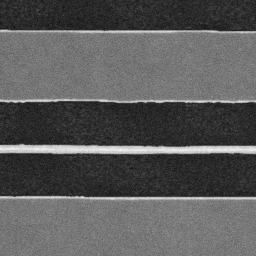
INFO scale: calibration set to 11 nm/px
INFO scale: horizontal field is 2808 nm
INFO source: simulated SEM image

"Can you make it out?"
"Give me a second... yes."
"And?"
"lines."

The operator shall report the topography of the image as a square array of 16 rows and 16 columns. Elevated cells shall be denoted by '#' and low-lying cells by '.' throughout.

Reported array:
................
................
################
################
################
################
................
................
................
................
................
................
################
################
################
################